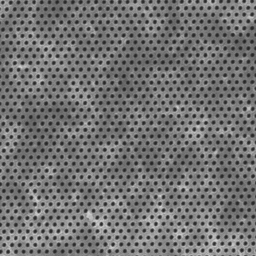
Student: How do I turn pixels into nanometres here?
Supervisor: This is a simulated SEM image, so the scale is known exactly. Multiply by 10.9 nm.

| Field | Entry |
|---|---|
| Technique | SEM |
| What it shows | a regular array of holes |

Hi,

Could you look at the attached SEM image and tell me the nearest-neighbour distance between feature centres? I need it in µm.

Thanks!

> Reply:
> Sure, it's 0.0798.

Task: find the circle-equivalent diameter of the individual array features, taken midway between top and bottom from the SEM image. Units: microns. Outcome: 0.0474